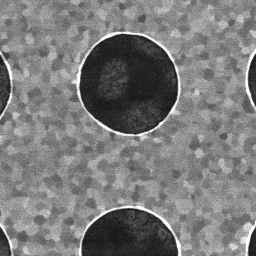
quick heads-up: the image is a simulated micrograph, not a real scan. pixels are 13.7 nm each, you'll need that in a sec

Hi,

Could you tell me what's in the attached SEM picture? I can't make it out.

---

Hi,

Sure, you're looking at holes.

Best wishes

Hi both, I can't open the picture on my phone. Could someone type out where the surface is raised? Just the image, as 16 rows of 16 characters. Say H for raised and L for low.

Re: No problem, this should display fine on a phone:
HHHHHHHHHHHHHHHH
HHHHHHHHHHHHHHHH
HHHHHHLLLHHHHHHH
HHHHHLLLLLLHHHHH
LHHHHLLLLLLHHHHL
LHHHHLLLLLLHHHHH
HHHHHLLLLLLHHHHH
HHHHHHLLLLHHHHHH
HHHHHHHHHHHHHHHH
HHHHHHHHHHHHHHHH
HHHHHHHHHHHHHHHH
HHHHHHHHHHHHHHHH
HHHHHHHHHHHHHHHH
HHHHHHLLLLHHHHHH
HHHHHLLLLLLHHHHH
LHHHHLLLLLLHHHHL